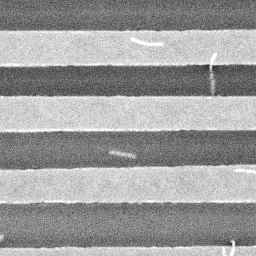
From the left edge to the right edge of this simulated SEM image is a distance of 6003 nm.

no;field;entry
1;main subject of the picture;lines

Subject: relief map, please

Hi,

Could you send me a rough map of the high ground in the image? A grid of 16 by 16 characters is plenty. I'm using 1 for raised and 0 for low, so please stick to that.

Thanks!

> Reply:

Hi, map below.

0000000000000000
0000000000000000
1111111111111111
1111111111111111
0000000000000000
0000000000000000
1111111111111111
1111111111111111
0000000000000000
0000000000000000
0000000111111111
1111111111111111
1111111111111111
0000000000000000
0000000000000000
0000000000011111